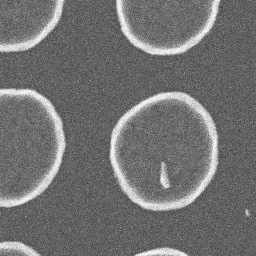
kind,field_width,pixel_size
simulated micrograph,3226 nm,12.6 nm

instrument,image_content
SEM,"raised bodies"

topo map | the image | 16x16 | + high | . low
++++...++++++...
+++.....+++++...
++......++++....
................
................
................
+++......+++....
++++....+++++...
++++...++++++...
++++...++++++...
+++....++++++...
+++.....+++++...
++.......+++....
................
................
++..............